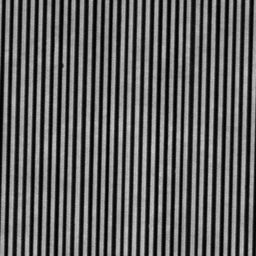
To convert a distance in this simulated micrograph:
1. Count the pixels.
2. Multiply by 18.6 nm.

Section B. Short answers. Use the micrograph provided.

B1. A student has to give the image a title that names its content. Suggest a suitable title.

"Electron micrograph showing parallel lines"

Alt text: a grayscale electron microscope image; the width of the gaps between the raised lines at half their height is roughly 86.1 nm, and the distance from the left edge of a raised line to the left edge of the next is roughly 154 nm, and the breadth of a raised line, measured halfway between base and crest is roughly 0.0698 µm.